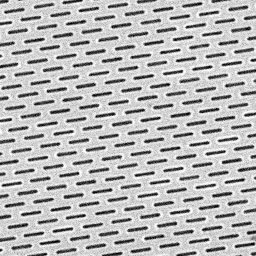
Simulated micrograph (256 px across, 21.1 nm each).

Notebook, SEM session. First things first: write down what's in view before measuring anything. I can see a regular array of holes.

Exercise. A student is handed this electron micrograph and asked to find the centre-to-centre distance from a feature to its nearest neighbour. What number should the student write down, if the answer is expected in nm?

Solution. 373